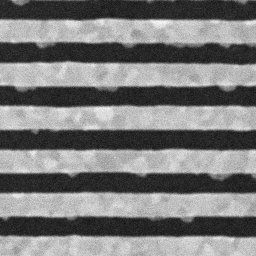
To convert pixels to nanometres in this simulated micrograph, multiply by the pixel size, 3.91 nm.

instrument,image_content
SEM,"lines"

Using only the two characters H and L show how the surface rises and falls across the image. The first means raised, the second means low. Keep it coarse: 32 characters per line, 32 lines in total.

LLLLLLLLLLLLLLLLLLLLLLLLLLLLLLLL
LLLLLLLLLLLLLLLLLLLLLLLLLLLLLLLL
LLLLLLLLLLLLHHHHLLLLLLLLLLLLLLLL
HHHHHHHHHHHHHHHHHHHHHHHHHHHHHHHH
HHHHHHHHHHHHHHHHHHHHHHHHHHHHHHHH
LLLLLLLLLLLLLLLLLLLLLLLLLLLLLLLL
LLLLLLLLLLLLLLLLLLLLLLLLLLLLLLLL
LLLLLLLLLLLLLLLLLLLLLLLLLLLLLLLL
HHHHHHHHHHHHHHHHHHHHHHHHHHHHHHHH
HHHHHHHHHHHHHHHHHHHHHHHHHHHHHHHH
HHHHHHHHHHHHHHHHHHHHHHHHHHHHHHHH
LLLLLLLLLLLLLLLLLLLLLLLLLLLLLLLL
LLLLLLLLLLLLLLLLLLLLLLLLLLLLLLLL
HHHHHHHHHHHHHHHHHHHHHHHHHHHHHHHH
HHHHHHHHHHHHHHHHHHHHHHHHHHHHHHHH
HHHHHHHHHHHHHHHHHHHHHHHHHHHHHHHH
LLLLLLLLLLLLLLLLLLLLLLLLLLLLLLLL
LLLLLLLLLLLLLLLLLLLLLLLLLLLLLLLL
LLLLLLLLLLLLLLLLLLLLLLLLLLLLLLLL
HHHHHHHHHHHHHHHHHHHHHHHHHHHHHHHH
HHHHHHHHHHHHHHHHHHHHHHHHHHHHHHHH
HHHHHHHHHHLLLLLLHHHHHHHHHHHHHHHH
LLLLLLLLLLLLLLLLLLLLLLLLLLLLLLLL
LLLLLLLLLLLLLLLLLLLLLLLLLLLLLLLL
HHHHHHHHHHHHHHHHHHHHHHHHHHHHHHHH
HHHHHHHHHHHHHHHHHHHHHHHHHHHHHHHH
HHHHHHHHHHHHHHHHHHHHHHHHHHHHHHHH
LLLLLLLLLLLLLLLLLLLLLLLLLLLLLLLL
LLLLLLLLLLLLLLLLLLLLLLLLLLLLLLLL
LLLLLLLLHHLLLLLLLLLLLLLLLLLLLLLL
HHHHHHHHHHHHHHHHHHHHHHHHHHHHHHHH
HHHHHHHHHHHHHHHHHHHHHHHHHHHHHHHH